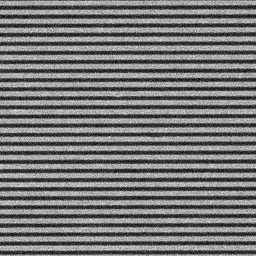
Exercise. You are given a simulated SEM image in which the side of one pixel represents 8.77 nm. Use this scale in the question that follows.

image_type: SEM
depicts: parallel lines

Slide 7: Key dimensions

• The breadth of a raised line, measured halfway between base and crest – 37.3 nanometers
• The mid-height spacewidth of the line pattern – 0.0417 micrometres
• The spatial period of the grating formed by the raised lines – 0.0796 um